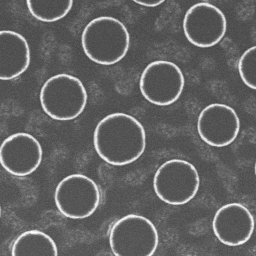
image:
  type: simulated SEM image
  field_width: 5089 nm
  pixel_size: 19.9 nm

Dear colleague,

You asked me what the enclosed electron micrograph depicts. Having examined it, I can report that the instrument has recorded a regular array of raised bodies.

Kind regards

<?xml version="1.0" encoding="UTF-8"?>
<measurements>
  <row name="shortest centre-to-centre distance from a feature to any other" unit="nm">1400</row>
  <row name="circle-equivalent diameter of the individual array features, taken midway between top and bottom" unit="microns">0.846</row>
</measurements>